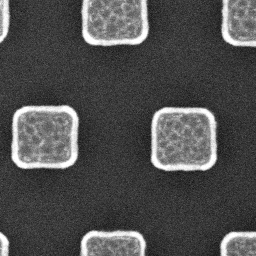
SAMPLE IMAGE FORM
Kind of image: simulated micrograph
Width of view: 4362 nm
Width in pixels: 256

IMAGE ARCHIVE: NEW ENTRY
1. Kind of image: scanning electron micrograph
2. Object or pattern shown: raised bodies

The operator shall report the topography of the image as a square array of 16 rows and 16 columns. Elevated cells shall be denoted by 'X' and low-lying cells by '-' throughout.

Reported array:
-----XXXX-----XX
-----XXXX-----XX
------XXX-----XX
----------------
----------------
----------------
----------------
-XXXX-----XXX---
-XXXX-----XXX---
-XXXX-----XXX---
-----------XX---
----------------
----------------
----------------
----------------
-----XXXX-----XX